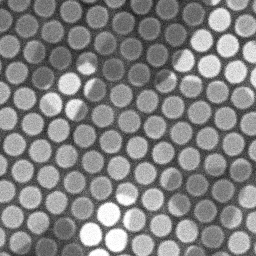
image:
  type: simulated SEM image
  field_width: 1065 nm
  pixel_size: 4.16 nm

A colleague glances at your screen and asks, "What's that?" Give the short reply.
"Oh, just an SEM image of a regular array of raised bodies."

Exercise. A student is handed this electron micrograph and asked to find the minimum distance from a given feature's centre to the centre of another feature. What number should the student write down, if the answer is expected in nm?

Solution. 110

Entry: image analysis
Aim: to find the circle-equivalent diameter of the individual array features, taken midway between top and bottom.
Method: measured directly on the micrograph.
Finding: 88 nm